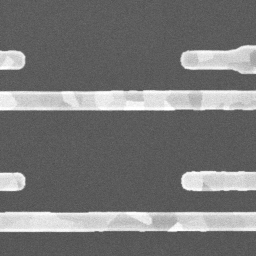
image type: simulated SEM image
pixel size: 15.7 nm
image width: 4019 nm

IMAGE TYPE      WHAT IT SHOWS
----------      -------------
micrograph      wiring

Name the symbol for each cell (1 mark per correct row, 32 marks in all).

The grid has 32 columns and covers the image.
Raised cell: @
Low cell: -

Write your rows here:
--------------------------------
--------------------------------
--------------------------------
--------------------------------
--------------------------------
--------------------------------
-@---------------------@@@@@@@@@
@@@--------------------@@@@@@@@@
@@----------------------@@@@@@@@
--------------------------------
--------------------------------
-----------------@@@@@@@@@@@@@@@
@@@@@@@@@@@@@@@@@@@@@@@@@@@@@@@@
@@@@@@@@@@@@@@@@@@@@@@@@@@@@@@@@
--------------------------------
--------------------------------
--------------------------------
--------------------------------
--------------------------------
--------------------------------
--------------------------------
--------------------------------
@@@--------------------@@@@@@@@@
@@@--------------------@@@@@@@@@
--------------------------------
--------------------------------
--------------------------------
@@@@@@@@@@@@@@@@@@@@@@@@@@@@@@@@
@@@@@@@@@@@@@@@@@@@@@@@@@@@@@@@@
--------------------------------
--------------------------------
--------------------------------